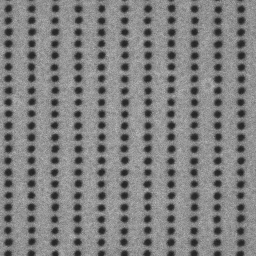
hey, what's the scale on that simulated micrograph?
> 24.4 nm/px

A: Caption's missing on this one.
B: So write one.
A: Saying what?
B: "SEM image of a regular array of holes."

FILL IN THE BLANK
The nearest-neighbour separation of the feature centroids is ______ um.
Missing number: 0.279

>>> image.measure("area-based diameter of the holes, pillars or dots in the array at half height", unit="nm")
191